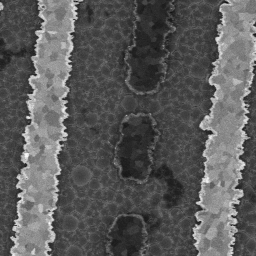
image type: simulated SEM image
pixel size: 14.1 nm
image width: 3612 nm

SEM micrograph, one or a few lines or trenches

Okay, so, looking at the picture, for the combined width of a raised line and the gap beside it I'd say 91.3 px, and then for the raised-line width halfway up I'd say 0.486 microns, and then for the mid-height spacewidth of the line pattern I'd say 799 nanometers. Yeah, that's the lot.